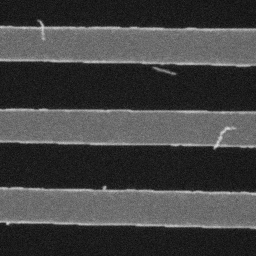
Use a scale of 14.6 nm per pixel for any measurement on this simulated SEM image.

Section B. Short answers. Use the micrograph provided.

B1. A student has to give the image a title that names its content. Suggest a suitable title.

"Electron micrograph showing lines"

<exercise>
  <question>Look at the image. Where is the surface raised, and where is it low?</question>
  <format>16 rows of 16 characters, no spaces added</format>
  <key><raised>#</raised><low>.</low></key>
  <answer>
................
................
################
################
................
................
................
################
################
................
................
................
################
################
................
................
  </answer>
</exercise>